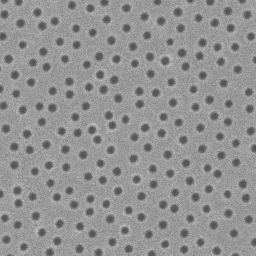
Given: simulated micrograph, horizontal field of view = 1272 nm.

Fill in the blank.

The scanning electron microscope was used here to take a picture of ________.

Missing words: a regular array of holes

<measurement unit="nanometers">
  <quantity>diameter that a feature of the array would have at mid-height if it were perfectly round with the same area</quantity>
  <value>41.6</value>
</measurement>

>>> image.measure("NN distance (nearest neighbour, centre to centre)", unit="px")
16.5